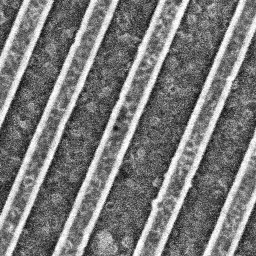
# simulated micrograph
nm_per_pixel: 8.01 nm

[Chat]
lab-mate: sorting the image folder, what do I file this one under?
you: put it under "one or a few lines or trenches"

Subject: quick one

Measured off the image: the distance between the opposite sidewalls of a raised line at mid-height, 174 nm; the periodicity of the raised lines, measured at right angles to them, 0.543 micrometres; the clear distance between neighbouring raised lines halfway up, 350 nm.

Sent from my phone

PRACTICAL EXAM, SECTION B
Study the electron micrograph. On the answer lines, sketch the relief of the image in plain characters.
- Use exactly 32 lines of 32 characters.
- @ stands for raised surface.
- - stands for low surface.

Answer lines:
---@@@-----@@@------@@@-------@@
---@@@-----@@@------@@@-------@@
--@@@------@@@-----@@@-------@@@
--@@@-----@@@------@@@-------@@@
-@@@@-----@@@-----@@@-------@@@-
-@@@-----@@@------@@@-------@@@-
-@@@-----@@@------@@@-------@@--
@@@-----@@@------@@@-------@@@--
@@@-----@@@------@@@-------@@@--
@@------@@------@@@-------@@@---
@@-----@@@------@@@-------@@@---
@@-----@@@-----@@@-------@@@----
@-----@@@------@@@-------@@@----
@-----@@@------@@@-------@@-----
------@@------@@@-------@@@-----
-----@@@------@@@-------@@@-----
-----@@@-----@@@-------@@@------
----@@@------@@@-------@@@------
----@@@------@@@------@@@------@
---@@@------@@@-------@@@------@
---@@@------@@@-------@@@------@
---@@------@@@-------@@@------@@
--@@@------@@@-------@@@------@@
--@@@-----@@@-------@@@------@@@
-@@@------@@@-------@@@------@@@
-@@@------@@@------@@@------@@@-
-@@------@@@-------@@@------@@@-
@@@------@@@-------@@@------@@@-
@@@-----@@@-------@@@------@@@--
@@------@@@-------@@@------@@@--
@@-----@@@@-------@@------@@@---
@------@@@-------@@@------@@@---